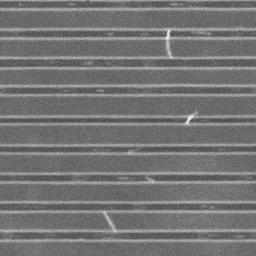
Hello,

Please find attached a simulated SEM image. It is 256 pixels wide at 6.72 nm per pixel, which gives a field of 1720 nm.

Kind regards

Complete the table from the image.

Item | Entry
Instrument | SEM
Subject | parallel lines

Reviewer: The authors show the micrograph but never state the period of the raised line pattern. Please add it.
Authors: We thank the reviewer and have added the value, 194 nm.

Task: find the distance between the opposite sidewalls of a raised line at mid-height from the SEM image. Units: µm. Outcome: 0.139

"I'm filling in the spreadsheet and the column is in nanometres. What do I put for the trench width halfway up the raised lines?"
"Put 57.1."